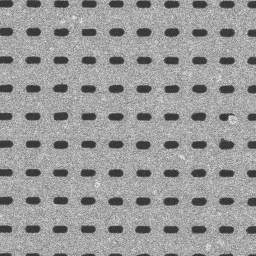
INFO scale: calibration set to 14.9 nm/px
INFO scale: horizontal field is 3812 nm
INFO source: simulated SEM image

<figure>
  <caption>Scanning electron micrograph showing a regular array of holes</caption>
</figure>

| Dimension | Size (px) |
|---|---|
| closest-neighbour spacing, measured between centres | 27.4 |